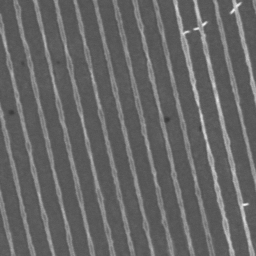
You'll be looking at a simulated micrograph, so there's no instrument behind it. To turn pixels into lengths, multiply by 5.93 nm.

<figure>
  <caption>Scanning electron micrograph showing parallel lines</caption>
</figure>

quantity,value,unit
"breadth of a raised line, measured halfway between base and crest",20.2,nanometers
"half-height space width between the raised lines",97.5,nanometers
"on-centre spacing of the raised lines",115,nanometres